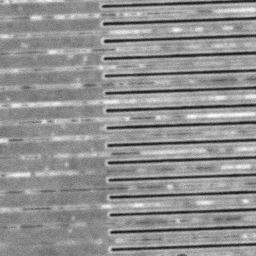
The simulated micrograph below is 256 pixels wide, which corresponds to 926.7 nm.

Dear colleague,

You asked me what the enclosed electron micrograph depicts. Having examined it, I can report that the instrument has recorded parallel lines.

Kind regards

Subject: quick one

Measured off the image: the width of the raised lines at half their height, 23 nm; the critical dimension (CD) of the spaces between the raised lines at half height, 0.0131 µm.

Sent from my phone